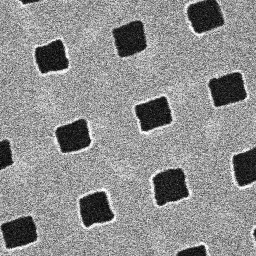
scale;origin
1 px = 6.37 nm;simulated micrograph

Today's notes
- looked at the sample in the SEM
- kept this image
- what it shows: holes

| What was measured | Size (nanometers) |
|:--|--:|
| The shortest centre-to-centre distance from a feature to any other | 485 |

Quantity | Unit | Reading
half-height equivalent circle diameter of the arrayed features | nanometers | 218